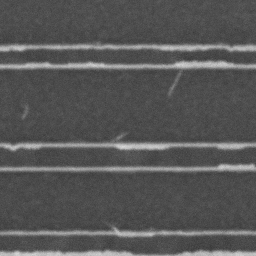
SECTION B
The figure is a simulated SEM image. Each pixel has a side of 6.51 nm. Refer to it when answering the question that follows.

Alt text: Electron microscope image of one or a few lines or trenches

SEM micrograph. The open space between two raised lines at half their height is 465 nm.